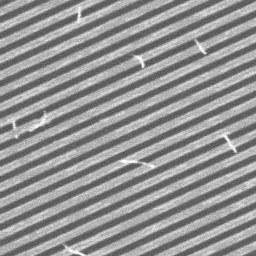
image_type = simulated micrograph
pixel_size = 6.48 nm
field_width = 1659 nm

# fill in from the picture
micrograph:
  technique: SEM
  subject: parallel lines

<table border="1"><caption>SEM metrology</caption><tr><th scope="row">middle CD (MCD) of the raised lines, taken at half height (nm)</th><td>55.3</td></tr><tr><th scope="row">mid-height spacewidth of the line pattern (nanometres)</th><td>38.2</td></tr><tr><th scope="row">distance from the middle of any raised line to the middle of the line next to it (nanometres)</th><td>94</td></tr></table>